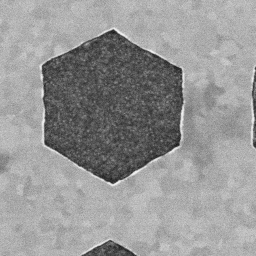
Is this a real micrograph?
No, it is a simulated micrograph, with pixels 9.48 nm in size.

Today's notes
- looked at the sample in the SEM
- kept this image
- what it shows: holes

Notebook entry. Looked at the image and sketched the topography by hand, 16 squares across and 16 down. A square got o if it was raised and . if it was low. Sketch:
oooooooooooooooo
oooooooooooooooo
oooooo..oooooooo
oooo......oooooo
ooo........ooooo
ooo........ooooo
ooo........ooooo
ooo........ooooo
ooo........ooooo
oooo.......ooooo
ooooo....ooooooo
oooooooooooooooo
oooooooooooooooo
oooooooooooooooo
oooooooooooooooo
oooooo..oooooooo